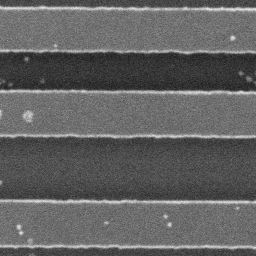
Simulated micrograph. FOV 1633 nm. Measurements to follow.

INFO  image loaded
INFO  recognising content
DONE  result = lines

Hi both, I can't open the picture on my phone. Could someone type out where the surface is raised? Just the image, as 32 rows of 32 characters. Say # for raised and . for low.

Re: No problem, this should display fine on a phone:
................................
################################
################################
################################
################################
################################
..................#...###.######
................................
................................
................................
................................
#############################.##
################################
################################
################################
################################
################################
................................
................................
................................
................................
................................
................................
................................
................................
################################
################################
################################
################################
################################
################################
................................